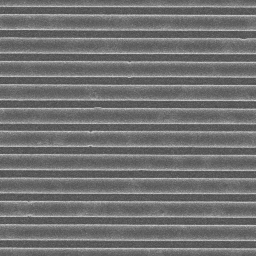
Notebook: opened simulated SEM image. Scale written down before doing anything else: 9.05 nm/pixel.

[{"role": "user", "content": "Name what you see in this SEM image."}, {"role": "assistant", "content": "parallel lines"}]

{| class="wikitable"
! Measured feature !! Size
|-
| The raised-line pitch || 0.211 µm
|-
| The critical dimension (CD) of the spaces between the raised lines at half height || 71.2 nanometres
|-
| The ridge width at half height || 141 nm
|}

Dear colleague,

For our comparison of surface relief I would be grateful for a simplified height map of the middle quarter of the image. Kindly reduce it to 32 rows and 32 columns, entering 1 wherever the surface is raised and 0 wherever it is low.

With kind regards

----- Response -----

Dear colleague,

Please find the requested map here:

11111111111111111111111111111111
11111111111111111111111111111111
11111111111111111111111111111111
00000000000000000000000000000000
00000000000000000000000000000000
11111111111111111111111111111111
11111111111111111111111111111111
11111111111111111111111111111111
11111111111111111111111111111111
00000000000000000000000000000000
00000000000000000000000000000000
11111111111111111111111111111111
11111111111111111111111111111111
11111111111111111111111111111111
11111111111111111111111111111111
00000000000000000000000000000000
00000000000000000000000000000000
11111111111111111111111111111111
11111111111111111111111111111111
11111111111111111111111111111111
00000001111111111111111111111111
00000000000000000000000000000000
00000000000000000000000000000000
11111111111111111111111111111111
11111111111111111111111111111111
11111111111111111111111111111111
00000000000000000000000000000000
00000000000000000000000000000000
00000000000000000000000000000000
11111111111111111111111111111111
11111111111111111111111111111111
11111111111111111111111111111111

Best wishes